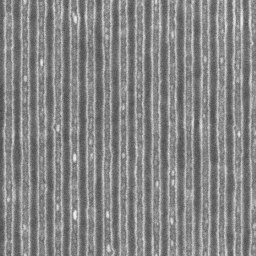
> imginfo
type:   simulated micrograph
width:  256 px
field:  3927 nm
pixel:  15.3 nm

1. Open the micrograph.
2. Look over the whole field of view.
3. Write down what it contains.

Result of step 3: parallel lines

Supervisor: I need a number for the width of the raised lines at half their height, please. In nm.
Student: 153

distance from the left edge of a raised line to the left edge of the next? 251 nanometers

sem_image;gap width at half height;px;6.38